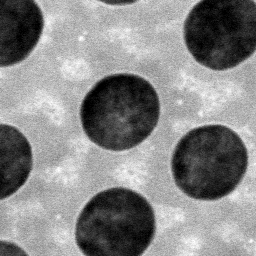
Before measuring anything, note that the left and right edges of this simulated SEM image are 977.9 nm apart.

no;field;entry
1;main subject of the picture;holes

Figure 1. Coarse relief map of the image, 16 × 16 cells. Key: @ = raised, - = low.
--@@@@@@@@@@----
---@@@@@@@@-----
--@@@@@@@@@-----
--@@@@@@@@@@----
@@@@@@@@@@@@@@@@
@@@@@@----@@@@@@
@@@@@-----@@@@@@
@@@@@-----@@@@@@
--@@@----@@----@
--@@@@@@@@@----@
--@@@@@@@@@----@
-@@@@@@@@@@----@
@@@@@@---@@@--@@
@@@@@-----@@@@@@
@@@@@-----@@@@@@
-@@@@----@@@@@@@